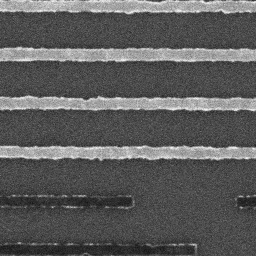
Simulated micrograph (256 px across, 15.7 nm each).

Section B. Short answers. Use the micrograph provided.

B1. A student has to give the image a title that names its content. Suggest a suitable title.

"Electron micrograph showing parallel lines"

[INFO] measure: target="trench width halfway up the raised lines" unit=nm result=593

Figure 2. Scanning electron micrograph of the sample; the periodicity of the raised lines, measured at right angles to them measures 768 nanometers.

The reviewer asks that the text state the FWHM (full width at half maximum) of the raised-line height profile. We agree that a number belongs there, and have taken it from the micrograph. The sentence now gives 177 nm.